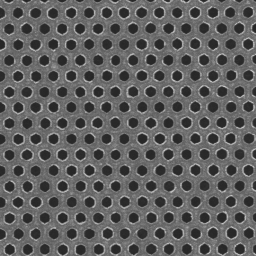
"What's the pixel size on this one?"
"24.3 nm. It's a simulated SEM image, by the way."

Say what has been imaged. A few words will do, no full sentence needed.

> a regular array of holes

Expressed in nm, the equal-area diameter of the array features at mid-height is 255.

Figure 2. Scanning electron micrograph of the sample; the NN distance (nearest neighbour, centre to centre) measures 17.5 pixels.